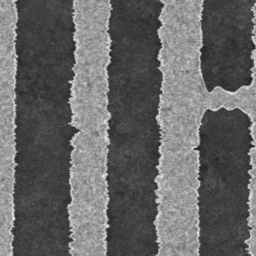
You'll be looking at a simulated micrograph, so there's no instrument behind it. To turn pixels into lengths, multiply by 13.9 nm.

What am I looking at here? one or a few lines or trenches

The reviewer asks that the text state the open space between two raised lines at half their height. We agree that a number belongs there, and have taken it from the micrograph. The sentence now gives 740 nm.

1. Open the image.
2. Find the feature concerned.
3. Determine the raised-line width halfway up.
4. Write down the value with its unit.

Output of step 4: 0.521 micrometres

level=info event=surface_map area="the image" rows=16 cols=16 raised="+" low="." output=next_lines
+....++...+++...
+....++...+++...
+....++...+++...
+....++...++....
+....++...+++...
+...+++...+++..+
+...+++...++++++
+....++...+++...
+....++...++....
+....++...++....
+...+++...++....
+...+++...++....
+...+++...++....
+...+++...++....
+...+++...++....
+...+++...++....